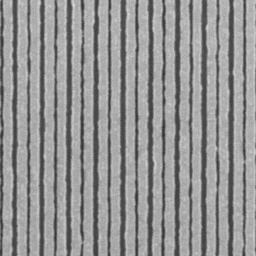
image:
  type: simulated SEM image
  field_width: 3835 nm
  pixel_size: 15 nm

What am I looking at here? parallel lines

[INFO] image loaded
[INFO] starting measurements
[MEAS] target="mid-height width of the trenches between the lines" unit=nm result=74.9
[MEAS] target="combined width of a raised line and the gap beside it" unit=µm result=0.202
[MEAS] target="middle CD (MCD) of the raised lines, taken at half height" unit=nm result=120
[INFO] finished